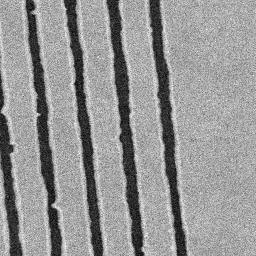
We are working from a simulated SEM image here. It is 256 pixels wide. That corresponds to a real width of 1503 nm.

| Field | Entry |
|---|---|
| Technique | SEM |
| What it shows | parallel lines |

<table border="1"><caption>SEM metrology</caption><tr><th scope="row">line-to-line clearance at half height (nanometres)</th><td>78.1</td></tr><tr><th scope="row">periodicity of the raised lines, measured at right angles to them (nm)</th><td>241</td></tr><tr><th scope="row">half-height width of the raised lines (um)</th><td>0.161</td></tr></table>